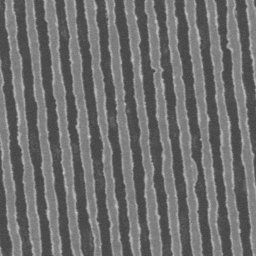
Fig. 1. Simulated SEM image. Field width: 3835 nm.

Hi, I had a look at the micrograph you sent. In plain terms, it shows parallel lines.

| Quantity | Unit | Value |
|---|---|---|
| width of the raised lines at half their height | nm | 136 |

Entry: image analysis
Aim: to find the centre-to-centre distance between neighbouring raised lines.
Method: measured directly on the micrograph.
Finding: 20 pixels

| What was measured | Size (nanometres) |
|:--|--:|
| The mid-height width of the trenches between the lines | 160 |